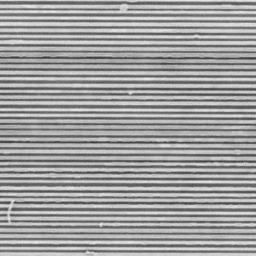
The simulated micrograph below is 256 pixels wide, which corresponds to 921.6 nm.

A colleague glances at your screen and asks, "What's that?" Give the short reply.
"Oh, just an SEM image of parallel lines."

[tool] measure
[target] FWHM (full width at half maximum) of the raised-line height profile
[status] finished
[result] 0.0131 microns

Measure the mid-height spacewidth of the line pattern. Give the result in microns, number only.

0.0099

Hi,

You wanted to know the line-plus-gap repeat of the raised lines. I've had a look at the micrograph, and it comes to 0.0218 um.